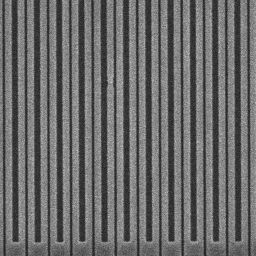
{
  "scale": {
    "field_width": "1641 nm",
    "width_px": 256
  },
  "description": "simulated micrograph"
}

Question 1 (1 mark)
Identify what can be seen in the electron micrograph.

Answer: parallel lines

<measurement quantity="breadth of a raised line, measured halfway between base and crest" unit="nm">44.9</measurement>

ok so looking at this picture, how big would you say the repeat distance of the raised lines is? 71.9 nanometers